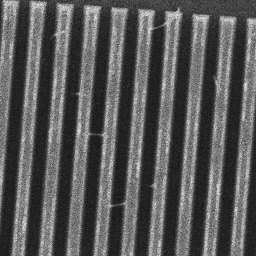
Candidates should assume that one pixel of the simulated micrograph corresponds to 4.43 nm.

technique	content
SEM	parallel lines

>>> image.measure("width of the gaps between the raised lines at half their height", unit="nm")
56.3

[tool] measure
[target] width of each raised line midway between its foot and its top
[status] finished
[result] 0.0645 um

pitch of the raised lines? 27.1 pixels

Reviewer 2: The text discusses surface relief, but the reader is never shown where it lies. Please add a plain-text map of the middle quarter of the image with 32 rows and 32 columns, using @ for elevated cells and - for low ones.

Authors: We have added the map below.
@---@@@@---@@@----@@@----@@@----
@---@@@@---@@@----@@@----@@@---@
@---@@@----@@@----@@@----@@@---@
@---@@@----@@@----@@@---@@@@---@
----@@@----@@@----@@@---@@@@---@
----@@@----@@@---@@@@---@@@@---@
----@@@----@@@---@@@@---@@@@---@
---@@@@---@@@@---@@@@---@@@@---@
----@@@---@@@@---@@@@---@@@----@
---@@@@---@@@@---@@@@---@@@----@
---@@@@---@@@@---@@@@---@@@----@
---@@@@---@@@@---@@@----@@@----@
---@@@@---@@@@---@@@----@@@----@
---@@@@---@@@----@@@----@@@---@@
---@@@@---@@@----@@@----@@@---@@
---@@@----@@@----@@@---@@@@---@@
---@@@----@@@----@@@---@@@@---@@
---@@@@--@@@@---@@@@---@@@@---@@
---@@@----@@@---@@@@---@@@@---@@
---@@@----@@@---@@@@---@@@@---@@
---@@@---@@@@---@@@@---@@@@---@@
---@@@---@@@@---@@@@---@@@----@@
--@@@@---@@@@---@@@@---@@@----@@
--@@@@---@@@@---@@@----@@@----@@
--@@@@---@@@@---@@@----@@@----@@
--@@@@---@@@----@@@----@@@----@@
--@@@@---@@@----@@@----@@@---@@@
--@@@----@@@----@@@----@@@---@@@
--@@@----@@@----@@@---@@@@---@@@
--@@@----@@@----@@@---@@@@---@@@
--@@@----@@@---@@@@---@@@@---@@@
--@@@----@@@---@@@@---@@@@---@@@